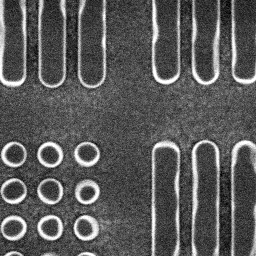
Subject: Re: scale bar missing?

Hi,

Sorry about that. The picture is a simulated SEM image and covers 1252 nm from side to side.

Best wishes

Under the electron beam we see groups of lines, slits or small figures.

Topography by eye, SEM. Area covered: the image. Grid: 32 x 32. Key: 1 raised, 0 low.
11100111001110000001110011100111
11100111001110000001110011100111
11100111001110000001110011100111
11100111001110000001110011100111
11100111001110000001110011100111
11100111001110000001110011100111
11100111001110000001110011100111
11100111001110000001110011100111
11100111001110000001110011100111
11100111001110000001110011100111
01000011001110000000000000000000
00000000000000000000000000000000
00000000000000000000000000000000
00000000000000000000000000000000
00000000000000000000000000000000
00000000000000000000000000000000
00000000000000000000000000000000
00000000000000000000000000000000
01100110001100000001110011100111
11100111001100000001110011100111
01100010000000000001110011100111
00000000000000000001110011100111
01000010000000000001110011100111
11100111001100000001110011100111
11100111001100000001110011100111
00000000000000000001110011100111
00000000000000000001110011100111
01100110001000000001110011100111
11100111011100000001110011100111
01100010001100000001110011100111
00000000000000000001110011100111
00000000000000000001110011100111